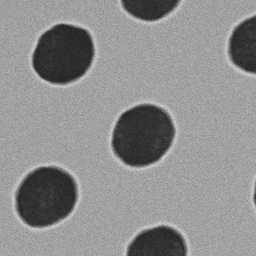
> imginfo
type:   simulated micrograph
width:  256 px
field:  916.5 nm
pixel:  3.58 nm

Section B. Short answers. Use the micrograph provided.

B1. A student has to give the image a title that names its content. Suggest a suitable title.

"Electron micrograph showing holes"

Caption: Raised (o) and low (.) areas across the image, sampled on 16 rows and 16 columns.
oooooooo...ooooo
ooooooooooooooo.
oo....oooooooo..
oo....oooooooo..
oo...ooooooooooo
oooooooooooooooo
oooooooooooooooo
ooooooo....ooooo
ooooooo....ooooo
ooooooo...oooooo
oooooooooooooooo
o....ooooooooooo
o....ooooooooooo
o...oooooooooooo
ooooooooo..ooooo
oooooooo....oooo